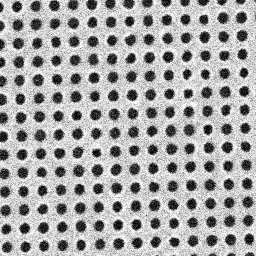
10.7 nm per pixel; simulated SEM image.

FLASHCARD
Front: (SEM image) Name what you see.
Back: a regular array of holes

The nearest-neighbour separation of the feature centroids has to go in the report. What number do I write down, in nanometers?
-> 195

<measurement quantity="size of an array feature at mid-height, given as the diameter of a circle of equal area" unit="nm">120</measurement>